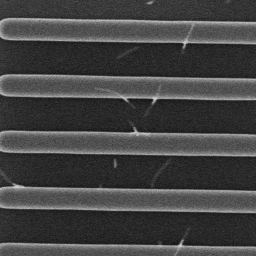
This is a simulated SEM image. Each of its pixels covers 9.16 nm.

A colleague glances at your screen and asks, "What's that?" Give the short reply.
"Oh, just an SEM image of groups of lines, slits or small figures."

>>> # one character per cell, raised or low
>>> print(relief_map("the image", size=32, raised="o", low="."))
................................
................................
ooooooooo.......................
oooooooooooooooooooooooooooooooo
oooooooooooooooooooooooooooooooo
................................
................................
................................
................................
ooooooooo.......................
oooooooooooooooooooooooooooooooo
oooooooooooooooooooooooooooooooo
...................o............
................................
................................
................................
oooo............................
oooooooooooooooooooooooooooooooo
oooooooooooooooooooooooooooooooo
...............................o
................................
................................
................................
ooooooooo.......................
oooooooooooooooooooooooooooooooo
oooooooooooooooooooooooooooooooo
..........................oooooo
................................
................................
................................
ooooooo.........................
oooooooooooooooooooooooooooooooo